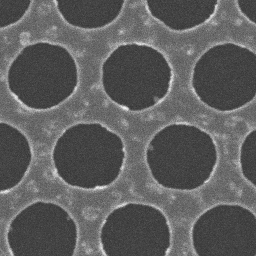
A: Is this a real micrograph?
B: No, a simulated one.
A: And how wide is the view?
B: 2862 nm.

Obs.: holes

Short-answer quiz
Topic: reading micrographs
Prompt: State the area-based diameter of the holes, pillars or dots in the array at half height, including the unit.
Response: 760 nm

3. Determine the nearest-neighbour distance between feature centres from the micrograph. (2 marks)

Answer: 1030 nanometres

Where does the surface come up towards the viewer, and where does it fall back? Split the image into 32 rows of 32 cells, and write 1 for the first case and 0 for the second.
00001110000000011100000000011100
00011110000000011110000000011100
00111111000000111111000000111110
11111111110011111111100011111111
11111111111111111111111111111111
11110011111111110111111111110111
11100000011111000000111111000000
11000000011110000000011110000000
10000000001110000000011100000000
10000000001110000000011100000000
10000000001110000000011100000000
11000000011110000000011100000000
11000000111111000000111110000001
11110011111111110011111111100011
11111111111111111111111111111111
01111111110011111111110111111111
00111111000000111111000000111110
00011110000000011110000000011110
00001110000000011100000000011100
00001110000000011100000000011100
00001110000000011110000000011100
00011110000000011110000000111100
00011111000000111110000000111110
01111111110011111111100001111111
11111111111111111111111111111111
11110001111111110111111111111111
11100000111111000000111111000001
11000000011110000000011110000000
10000000001110000000011100000000
10000000001110000000011100000000
10000000001110000000011100000000
10000000011110000000011100000000